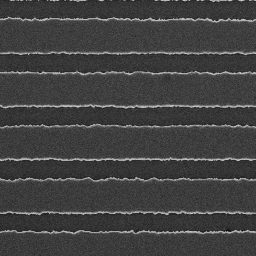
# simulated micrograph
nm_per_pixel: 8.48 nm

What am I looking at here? lines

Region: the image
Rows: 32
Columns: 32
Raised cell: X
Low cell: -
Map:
--------------------------------
--------------------------------
XXXXXXXXXXXXXXXXXXXXXXXXXXXXXXXX
XXXXXXXXXXXXXXXXXXXXXXXXXXXXXXXX
XXXXXXXXXXXXXXXXXXXXXXXXXXXXXXXX
XXXXXXXXXXXXXXXXXXXXXXXXXXXXXXXX
XXXXXXXXXXXXXXXXXXXXXXXXXXXXXXXX
--------------------------------
--------------------------------
XXXXXXXXXXXXXXXXXXXXXXXXXXXXXXXX
XXXXXXXXXXXXXXXXXXXXXXXXXXXXXXXX
XXXXXXXXXXXXXXXXXXXXXXXXXXXXXXXX
XXXXXXXXXXXXXXXXXXXXXXXXXXXXXXXX
--------------------------------
--------------------------------
--------------------------------
XXXXXXXXXXXXXXXXXXXXXXXXXXXXXXXX
XXXXXXXXXXXXXXXXXXXXXXXXXXXXXXXX
XXXXXXXXXXXXXXXXXXXXXXXXXXXXXXXX
XXXXXXXXXXXXXXXXXXXXXXXXXXXXXXXX
--------------------------------
--------------------------------
X-XXXXXXXXXXXXXXXXXXXXXXXXXXXXXX
XXXXXXXXXXXXXXXXXXXXXXXXXXXXXXXX
XXXXXXXXXXXXXXXXXXXXXXXXXXXXXXXX
XXXXXXXXXXXXXXXXXXXXXXXXXXXXXXXX
XXXXXXXXXXXXXXXXXXXXXXXXXXXXXXXX
--------------------------------
--------------------------------
XXXXXXXXXXXXXXXXXXXXXXXXXXXXXXXX
XXXXXXXXXXXXXXXXXXXXXXXXXXXXXXXX
XXXXXXXXXXXXXXXXXXXXXXXXXXXXXXXX